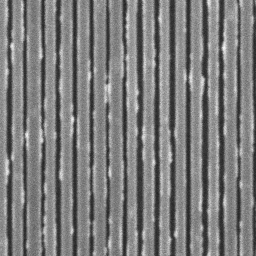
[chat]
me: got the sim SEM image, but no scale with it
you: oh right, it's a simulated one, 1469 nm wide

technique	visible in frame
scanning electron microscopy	parallel lines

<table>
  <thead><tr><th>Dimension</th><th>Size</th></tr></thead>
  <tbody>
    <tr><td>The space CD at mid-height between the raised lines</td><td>4.88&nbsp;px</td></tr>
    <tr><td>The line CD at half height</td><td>0.0682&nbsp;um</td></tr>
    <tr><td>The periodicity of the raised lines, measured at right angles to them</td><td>0.094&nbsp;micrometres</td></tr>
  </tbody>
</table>